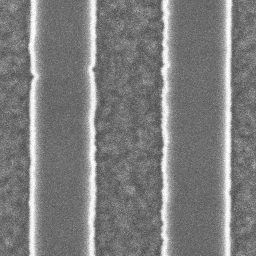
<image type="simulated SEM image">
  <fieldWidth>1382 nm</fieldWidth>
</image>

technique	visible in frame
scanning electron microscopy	one or a few lines or trenches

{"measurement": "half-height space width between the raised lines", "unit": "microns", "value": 0.382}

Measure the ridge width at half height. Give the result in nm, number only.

341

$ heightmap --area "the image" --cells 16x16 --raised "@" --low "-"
--@@@@----@@@@--
--@@@@----@@@@--
--@@@@----@@@@--
--@@@@----@@@@--
--@@@@----@@@@--
--@@@@----@@@@--
--@@@@----@@@@--
--@@@@----@@@@--
--@@@@----@@@@--
--@@@@----@@@@--
--@@@@----@@@@--
--@@@@----@@@@--
--@@@@----@@@@--
--@@@@----@@@@--
--@@@@----@@@@--
--@@@@----@@@@--